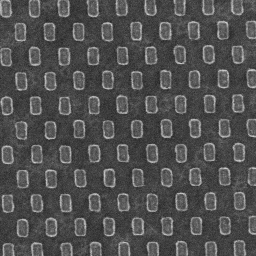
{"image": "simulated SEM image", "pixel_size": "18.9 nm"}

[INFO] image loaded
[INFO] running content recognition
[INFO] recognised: a regular array of raised bodies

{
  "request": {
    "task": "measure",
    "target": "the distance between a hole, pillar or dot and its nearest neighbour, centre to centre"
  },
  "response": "0.533 um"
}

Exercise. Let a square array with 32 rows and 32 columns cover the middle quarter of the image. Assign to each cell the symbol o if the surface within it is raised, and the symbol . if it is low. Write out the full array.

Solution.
................................
................................
...oo.....oo.....oo.....ooo....o
...oo.....oo.....oo.....ooo....o
...oo.....oo.....oo.....ooo....o
...oo.....oo.....oo.....ooo....o
................................
................................
o......o.....ooo.....oo.....oo..
o.....ooo....ooo.....oo.....oo..
o.....ooo....ooo.....oo.....oo..
oo....ooo....ooo.....oo.....oo..
................................
................................
...oo.....oo.....oo.....ooo.....
...oo.....oo.....oo.....ooo.....
...oo.....oo.....ooo....ooo.....
...oo.....oo.....ooo.....oo.....
................................
................................
.......o.....ooo.....oo.....oo..
oo....ooo....ooo.....oo.....oo..
oo....ooo....ooo.....oo.....ooo.
oo....ooo.....oo.....oo.....ooo.
o...............................
................................
...oo.....oo......o......oo.....
...oo.....oo.....ooo....ooo.....
...oo.....oo.....ooo.....oo.....
...oo.....oo.....ooo.....oo.....
...oo......o....................
................................